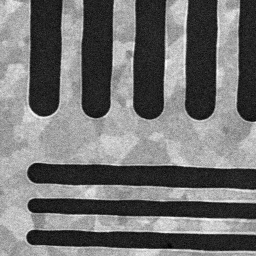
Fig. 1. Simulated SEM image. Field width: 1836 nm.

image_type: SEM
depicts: groups of lines, slits or small figures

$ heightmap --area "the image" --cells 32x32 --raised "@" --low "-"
@@@@----@@----@@@----@@----@@@--
@@@@----@@----@@@----@@----@@@--
@@@@----@@----@@@----@@----@@@--
@@@@----@@----@@@----@@----@@@--
@@@@----@@----@@@----@@----@@@--
@@@@----@@----@@@----@@----@@@--
@@@@----@@----@@@----@@----@@@--
@@@@----@@----@@@----@@----@@@--
@@@@----@@----@@-----@@----@@@--
@@@@----@@----@@@----@@----@@@--
@@@@----@@----@@@----@@----@@@--
@@@-----@@----@@@----@@----@@@--
@@@-----@@----@@-----@@----@@---
@@@@---@@@----@@@----@@----@@@--
@@@@@-@@@@@--@@@@---@@@@--@@@@--
@@@@@@@@@@@@@@@@@@@@@@@@@@@@@@@@
@@@@@@@@@@@@@@@@@@@@@@@@@@@@@@@@
@@@@@@@@@@@@@@@@@@@@@@@@@@@@@@@@
@@@@@@@@@@@@@@@@@@@@@@@@@@@@@@@@
@@@@@@@@@@@@@@@@@@@@@@@@@@@@@@@@
@@@@---------@@@@@@@@@@@@@@@@@@@
@@@-----------------------------
@@@@----------------------------
@@@@@@@@@@@@@@@@@@@@@@----------
@@@@@@@@@@@@@@@@@@@@@@@@@@@@@@@@
@@@-----------------------------
@@@@----------------------------
@@@@@@@@@@@@@@@@@@@@@@@@@@------
@@@@@@@@@@@@@@@@@@@@@@@@@@@@@@@@
@@@-----------------------------
@@@@----------------------------
@@@@@@@@@@@@@@@@@@@@@@@@@@------